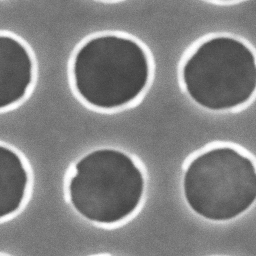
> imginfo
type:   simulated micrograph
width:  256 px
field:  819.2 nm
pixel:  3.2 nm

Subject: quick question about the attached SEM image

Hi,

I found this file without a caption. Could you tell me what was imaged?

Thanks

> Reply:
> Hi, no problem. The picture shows holes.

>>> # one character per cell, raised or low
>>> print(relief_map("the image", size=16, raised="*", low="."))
****************
****************
.*****..*****..*
..***....***....
..***....***....
..***....***....
.*****..****...*
****************
****************
.*****..*****..*
.****....***....
..**.....**.....
.***.....***....
*****...*****..*
****************
****************